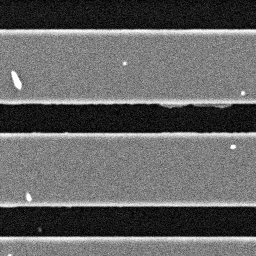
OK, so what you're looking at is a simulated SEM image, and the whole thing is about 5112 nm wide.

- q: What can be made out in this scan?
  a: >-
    lines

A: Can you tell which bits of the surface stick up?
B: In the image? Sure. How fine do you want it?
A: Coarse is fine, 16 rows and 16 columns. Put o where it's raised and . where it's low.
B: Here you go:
................
................
oooooooooooooooo
oooooooooooooooo
oooooooooooooooo
oooooooooooooooo
................
................
oooooooooooooooo
oooooooooooooooo
oooooooooooooooo
oooooooooooooooo
oooooooooooooooo
................
................
oooooooooooooooo